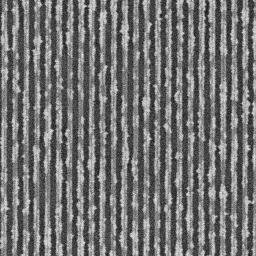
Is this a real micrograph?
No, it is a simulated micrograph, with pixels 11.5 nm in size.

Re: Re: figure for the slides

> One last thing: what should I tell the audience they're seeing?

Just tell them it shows parallel lines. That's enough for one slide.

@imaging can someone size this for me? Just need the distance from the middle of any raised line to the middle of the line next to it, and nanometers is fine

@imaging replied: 126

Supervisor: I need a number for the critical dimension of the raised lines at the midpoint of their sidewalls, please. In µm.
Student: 0.0548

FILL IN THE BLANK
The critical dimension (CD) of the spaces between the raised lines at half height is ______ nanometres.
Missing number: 72.1